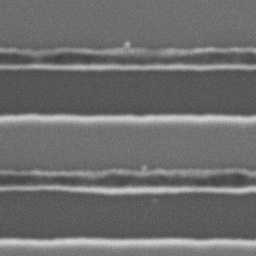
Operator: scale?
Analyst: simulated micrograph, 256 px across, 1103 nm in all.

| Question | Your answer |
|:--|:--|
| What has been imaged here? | lines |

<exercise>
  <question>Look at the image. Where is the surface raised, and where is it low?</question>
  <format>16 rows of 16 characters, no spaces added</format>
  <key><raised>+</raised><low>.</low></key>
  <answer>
++++++++++++++++
++++++++++++++++
++++++++++++++++
++++++++++++++++
................
................
................
++++++++++++++++
++++++++++++++++
++++++++++++++++
++++++++++++++++
++++++++++++++++
................
................
................
++++++++++++++++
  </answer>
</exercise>